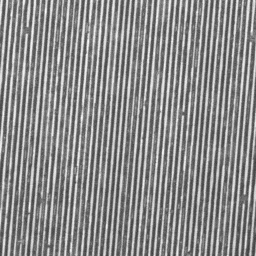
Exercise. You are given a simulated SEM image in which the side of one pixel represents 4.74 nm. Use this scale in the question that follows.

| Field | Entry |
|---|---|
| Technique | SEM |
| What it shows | parallel lines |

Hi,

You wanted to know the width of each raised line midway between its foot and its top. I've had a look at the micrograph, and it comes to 8.3 nm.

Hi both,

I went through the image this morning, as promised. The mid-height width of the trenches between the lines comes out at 20.7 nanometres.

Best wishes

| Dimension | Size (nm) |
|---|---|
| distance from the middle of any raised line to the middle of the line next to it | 26.6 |